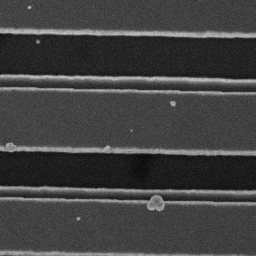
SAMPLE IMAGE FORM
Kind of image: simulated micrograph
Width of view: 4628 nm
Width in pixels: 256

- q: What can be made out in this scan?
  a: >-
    lines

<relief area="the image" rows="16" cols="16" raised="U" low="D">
UUUUUUUUUUUUUUUU
UUUUUUUUUUUUUUUU
DDDDDDDDDDDDDDDD
DDDDDDDDDDDDDDDD
DDDDDDDDDDDDDDDD
UUUUUUUUUUUUUUUU
UUUUUUUUUUUUUUUU
UUUUUUUUUUUUUUUU
UUUUUUUUUUUUUUUU
DDDDDDDDDDDUUUUU
DDDDDDDDDDDDDDDD
DDDDDDDDDDDDDDDD
UUUUUUUUUUUUUUUU
UUUUUUUUUUUUUUUU
UUUUUUUUUUUUUUUU
UUUUUUUUUUUUUUUU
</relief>